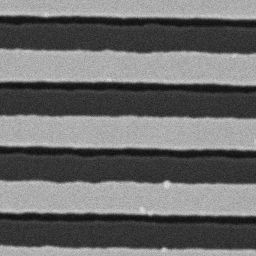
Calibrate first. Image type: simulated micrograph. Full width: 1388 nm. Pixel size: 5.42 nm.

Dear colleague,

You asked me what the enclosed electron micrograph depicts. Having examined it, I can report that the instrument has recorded lines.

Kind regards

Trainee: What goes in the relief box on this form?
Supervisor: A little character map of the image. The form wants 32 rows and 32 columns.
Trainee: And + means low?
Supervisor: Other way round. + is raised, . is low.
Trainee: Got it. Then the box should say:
++++++++++++++++++++++++++++++++
++++++++++++++++++++++++++++++++
................................
................................
................................
................................
+++++++++++++++.......+.........
++++++++++++++++++++++++++++++++
++++++++++++++++++++++++++++++++
++++++++++++++++++++++++++++++++
...........................+++++
................................
................................
................................
+.+++...........+...............
++++++++++++++++++++++++++++++++
++++++++++++++++++++++++++++++++
++++++++++++++++++++++++++++++++
...................+++++++++++++
................................
................................
................................
................................
++++++++++++++++++++++++++++++++
++++++++++++++++++++++++++++++++
++++++++++++++++++++++++++++++++
++++++++++++++++++++++++++++++++
................................
................................
................................
................................
++++++++++++++++++++++++++++++++